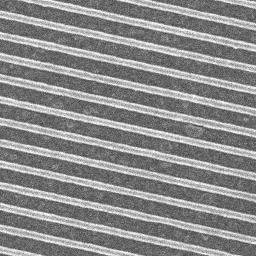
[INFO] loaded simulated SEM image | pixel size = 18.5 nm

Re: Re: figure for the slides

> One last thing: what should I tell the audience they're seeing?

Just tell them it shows parallel lines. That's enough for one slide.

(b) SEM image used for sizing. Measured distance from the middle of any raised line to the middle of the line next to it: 388 nm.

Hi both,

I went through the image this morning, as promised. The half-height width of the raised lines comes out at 0.111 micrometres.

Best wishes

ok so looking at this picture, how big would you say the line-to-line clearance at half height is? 267 nm